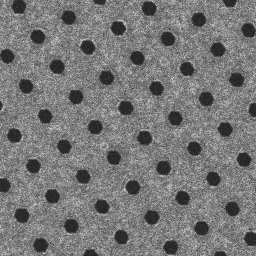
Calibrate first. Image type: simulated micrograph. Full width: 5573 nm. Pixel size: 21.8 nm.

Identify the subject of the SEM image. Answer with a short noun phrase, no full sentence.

a regular array of holes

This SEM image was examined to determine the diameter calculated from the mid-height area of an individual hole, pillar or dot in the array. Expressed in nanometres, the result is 331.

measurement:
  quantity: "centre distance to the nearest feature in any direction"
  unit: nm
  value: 774